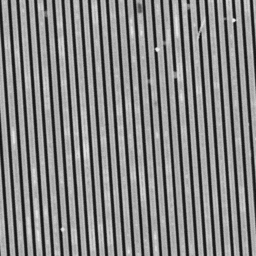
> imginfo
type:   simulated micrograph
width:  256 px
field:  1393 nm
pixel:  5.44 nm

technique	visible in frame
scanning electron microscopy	parallel lines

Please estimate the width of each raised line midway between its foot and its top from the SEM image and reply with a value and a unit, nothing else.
31.9 nm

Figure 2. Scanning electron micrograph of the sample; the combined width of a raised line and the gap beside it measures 48.6 nm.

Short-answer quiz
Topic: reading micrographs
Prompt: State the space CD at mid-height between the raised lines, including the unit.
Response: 0.0183 microns